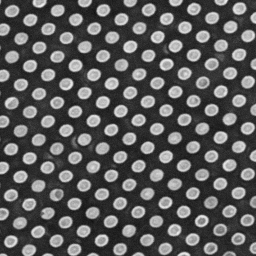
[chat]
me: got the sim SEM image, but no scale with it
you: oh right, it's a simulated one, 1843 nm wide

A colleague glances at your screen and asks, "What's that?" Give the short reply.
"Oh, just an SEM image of a regular array of raised bodies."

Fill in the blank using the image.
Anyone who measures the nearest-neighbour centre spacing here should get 145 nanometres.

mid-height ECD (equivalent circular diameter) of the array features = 0.0886 µm